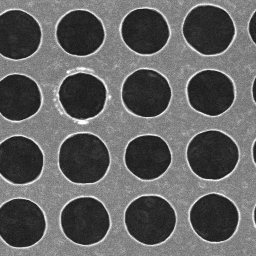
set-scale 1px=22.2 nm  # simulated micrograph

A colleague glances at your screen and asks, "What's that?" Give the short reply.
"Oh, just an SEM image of a regular array of holes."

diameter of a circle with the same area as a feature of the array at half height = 1.08 µm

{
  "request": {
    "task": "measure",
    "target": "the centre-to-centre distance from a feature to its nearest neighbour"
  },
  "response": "1390 nm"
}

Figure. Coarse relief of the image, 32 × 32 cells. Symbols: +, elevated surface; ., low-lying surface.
++++++++++++++++++++++++++++++++
+..++++++..+++++....++++....++++
....++++....+++......++......++.
.....++......++......++......++.
.....++......++......++......++.
.....++......+++.....+++.....+++
....++++....+++++...+++++...++++
++++++++++++++++++++++++++++++++
++++++++++++++++++++++++++++++++
+..++++++...++++....++++....++++
.....+++.....++......+++.....+++
.....++......++......++......+++
.....++......++......+++.....+++
.....+++.....+++.....+++.....+++
....+++++...+++++...++++++++++++
++++++++++++++++++++++++++++++++
+++++++++++++++++++++++++...++++
+...++++.....++++...++++.....+++
.....+++.....+++.....++.......++
.....++.......++.....++.......++
.....++.......++.....+++......++
.....+++.....+++.....+++.....+++
+...+++++...++++++++++++++++++++
++++++++++++++++++++++++++++++++
++++++++++++++++++.+++++++..++++
+...++++.....+++.....+++.....+++
.....+++.....+++......++......++
......++......++......++......++
......++......++......++......++
.....+++.....++++....++++....+++
+...++++++..++++++..++++++++++++
++++++++++++++++++++++++++++++++